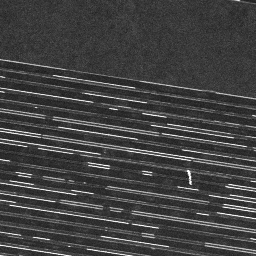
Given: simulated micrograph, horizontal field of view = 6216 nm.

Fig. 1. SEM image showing parallel lines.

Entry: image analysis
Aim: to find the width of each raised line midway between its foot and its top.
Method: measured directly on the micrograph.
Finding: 66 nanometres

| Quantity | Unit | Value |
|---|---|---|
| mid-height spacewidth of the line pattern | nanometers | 183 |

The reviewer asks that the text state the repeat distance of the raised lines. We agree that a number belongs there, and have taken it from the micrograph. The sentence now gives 0.247 micrometres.